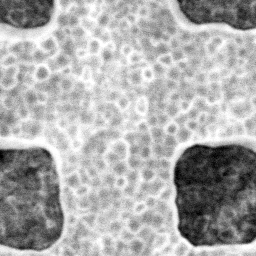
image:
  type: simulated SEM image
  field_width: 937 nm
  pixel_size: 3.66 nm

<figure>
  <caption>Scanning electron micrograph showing holes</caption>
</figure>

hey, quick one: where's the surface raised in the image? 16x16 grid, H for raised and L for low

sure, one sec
LLLLHHHHHHHLLLLL
LLLHHHHHHHHHLHLL
HHHHHHHHHHHHHHHH
HHHHHHHHHHHHHHHH
HHHHHHHHHHHHHHHH
HHHHHHHHHHHHHHHH
HHHHHHHHHHHHHHHH
HHHHHHHHHHHHHHHH
HHHHHHHHHHHHHHHH
LLLHHHHHHHHHLLLL
LLLLHHHHHHHLLLLL
LLLLHHHHHHHLLLLL
LLLLHHHHHHHLLLLL
LLLLHHHHHHHLLLLL
LLLLHHHHHHHLLLLL
HLLHHHHHHHHHHHHH